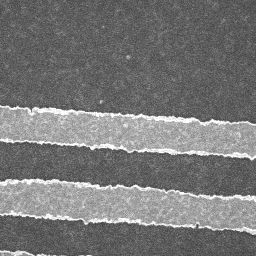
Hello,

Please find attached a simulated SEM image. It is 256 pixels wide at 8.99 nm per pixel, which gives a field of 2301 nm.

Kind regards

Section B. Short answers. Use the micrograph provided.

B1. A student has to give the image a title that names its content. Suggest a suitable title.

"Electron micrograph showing one or a few lines or trenches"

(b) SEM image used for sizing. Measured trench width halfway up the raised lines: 339 nm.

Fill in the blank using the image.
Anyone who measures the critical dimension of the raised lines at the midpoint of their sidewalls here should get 313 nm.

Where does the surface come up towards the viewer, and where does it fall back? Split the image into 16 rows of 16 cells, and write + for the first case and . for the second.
................
................
................
................
................
................
................
++++++++++++....
++++++++++++++++
..........++++++
................
++++++..........
++++++++++++++++
..++++++++++++++
...............+
................